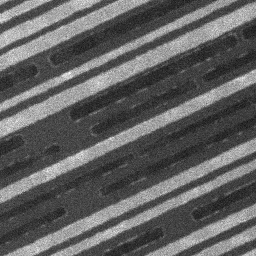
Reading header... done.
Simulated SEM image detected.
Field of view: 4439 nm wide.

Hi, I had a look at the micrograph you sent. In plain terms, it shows parallel lines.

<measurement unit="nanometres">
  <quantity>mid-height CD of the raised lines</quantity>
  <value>186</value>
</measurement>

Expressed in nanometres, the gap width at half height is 174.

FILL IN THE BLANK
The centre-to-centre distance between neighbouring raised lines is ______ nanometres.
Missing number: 348